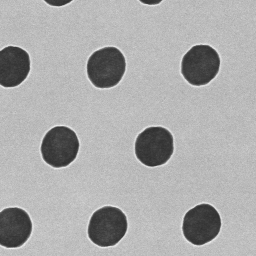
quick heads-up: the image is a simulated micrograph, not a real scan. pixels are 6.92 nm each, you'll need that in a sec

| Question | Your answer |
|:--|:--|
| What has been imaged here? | holes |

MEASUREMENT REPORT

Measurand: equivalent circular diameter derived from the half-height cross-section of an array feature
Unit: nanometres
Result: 269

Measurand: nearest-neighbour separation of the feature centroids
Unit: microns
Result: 0.634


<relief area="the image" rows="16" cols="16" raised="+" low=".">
++++++++++++++++
++++++++++++++++
++++++++++++++++
..++++..++++..++
..++++..+++...++
++++++++++++++++
++++++++++++++++
++++++++++++++++
+++..++++..+++++
+++..++++..+++++
++++++++++++++++
++++++++++++++++
++++++++++++++++
..++++..++++..++
..++++..++++..++
++++++++++++++++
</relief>